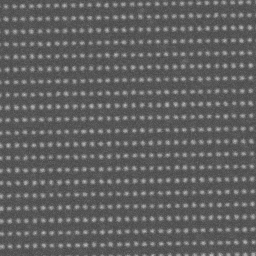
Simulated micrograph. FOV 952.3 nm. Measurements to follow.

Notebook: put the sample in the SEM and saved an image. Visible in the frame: a regular array of raised bodies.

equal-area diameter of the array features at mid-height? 14.6 nm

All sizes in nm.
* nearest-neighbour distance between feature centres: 30.6